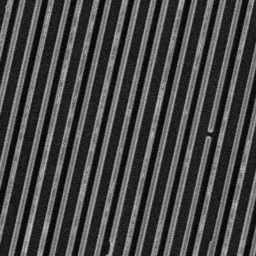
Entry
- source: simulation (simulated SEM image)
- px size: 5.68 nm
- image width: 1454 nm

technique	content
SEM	parallel lines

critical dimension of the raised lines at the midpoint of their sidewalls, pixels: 5.25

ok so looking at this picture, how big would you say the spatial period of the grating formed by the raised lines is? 13.9 pixels